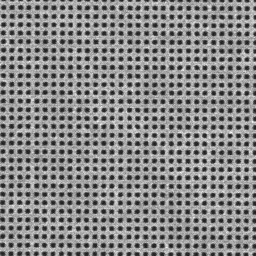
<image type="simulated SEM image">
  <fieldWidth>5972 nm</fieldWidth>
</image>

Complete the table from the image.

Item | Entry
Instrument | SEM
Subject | a regular array of holes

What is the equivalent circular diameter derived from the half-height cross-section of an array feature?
0.132 um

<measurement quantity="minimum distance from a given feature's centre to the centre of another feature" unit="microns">0.189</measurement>